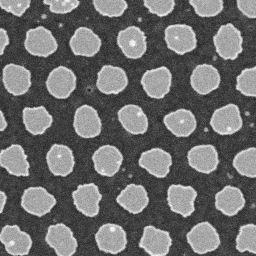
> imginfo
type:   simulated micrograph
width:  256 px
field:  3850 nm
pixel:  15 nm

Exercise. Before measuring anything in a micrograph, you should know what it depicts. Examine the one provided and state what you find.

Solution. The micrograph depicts a regular array of raised bodies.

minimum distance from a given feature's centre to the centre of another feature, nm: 662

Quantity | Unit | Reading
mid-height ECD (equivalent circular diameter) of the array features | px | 29.1